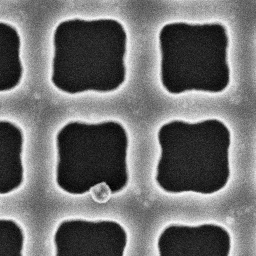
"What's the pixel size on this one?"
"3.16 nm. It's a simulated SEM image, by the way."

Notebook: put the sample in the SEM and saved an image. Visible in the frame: holes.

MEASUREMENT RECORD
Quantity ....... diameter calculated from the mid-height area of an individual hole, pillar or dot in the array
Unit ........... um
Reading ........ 0.246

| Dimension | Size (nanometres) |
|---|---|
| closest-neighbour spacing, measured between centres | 316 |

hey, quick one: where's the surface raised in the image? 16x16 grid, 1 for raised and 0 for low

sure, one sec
1111111111111111
1111000111101011
0110000011000011
0110000011000011
0110000011000011
0111000111000011
1111111111111111
1111111111111011
0111000011000011
0111000011000011
0111000011000011
0111000011000011
1111111111111111
1111111111111111
0110000011000011
0110000011000011